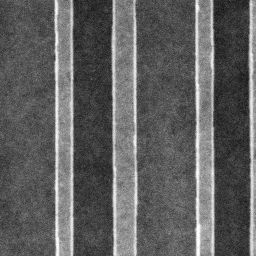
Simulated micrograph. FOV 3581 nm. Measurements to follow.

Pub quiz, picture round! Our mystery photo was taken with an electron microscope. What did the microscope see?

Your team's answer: lines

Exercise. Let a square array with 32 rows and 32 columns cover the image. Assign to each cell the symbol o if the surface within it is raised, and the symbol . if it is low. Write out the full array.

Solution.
.......oo.....ooo........o.....o
.......oo.....ooo........o.....o
.......oo.....ooo........o.....o
.......oo.....ooo........o.....o
.......oo.....ooo........o.....o
.......oo.....ooo........oo....o
.......oo.....ooo........oo....o
.......oo.....ooo........oo....o
.......oo.....ooo........oo....o
.......oo.....ooo........oo....o
.......oo.....ooo........oo....o
.......oo.....ooo........oo....o
.......oo.....ooo........oo....o
.......oo.....ooo........oo....o
.......oo.....ooo........oo....o
.......oo.....ooo........oo....o
.......oo.....ooo........oo....o
.......oo.....ooo........oo....o
.......oo.....ooo........oo....o
.......oo.....ooo........oo.....
.......oo.....ooo........oo.....
.......oo.....ooo........oo.....
.......oo.....ooo........oo.....
.......oo.....ooo........oo.....
.......oo.....ooo........oo.....
.......oo.....ooo........oo.....
.......oo.....ooo........oo.....
.......oo.....ooo........oo.....
.......oo.....ooo........oo.....
.......oo.....ooo........oo.....
.......oo.....ooo........oo.....
.......oo.....ooo........oo.....